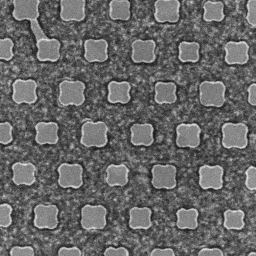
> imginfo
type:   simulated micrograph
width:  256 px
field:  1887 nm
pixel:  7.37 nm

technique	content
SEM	a regular array of raised bodies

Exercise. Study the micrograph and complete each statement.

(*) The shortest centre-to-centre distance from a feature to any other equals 0.345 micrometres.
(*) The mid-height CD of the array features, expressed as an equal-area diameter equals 24.3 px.